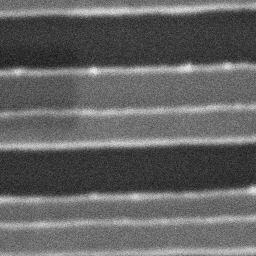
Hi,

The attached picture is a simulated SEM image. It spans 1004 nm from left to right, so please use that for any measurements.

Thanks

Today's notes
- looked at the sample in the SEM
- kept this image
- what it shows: lines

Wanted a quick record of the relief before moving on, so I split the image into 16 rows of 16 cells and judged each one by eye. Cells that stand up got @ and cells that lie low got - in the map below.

@@@@@@@@@@@@@---
----------------
----------------
----------------
-@@@@@@@@@@@@@@@
@@@@@@@@@@@@@@@@
@@@@@@@@@@@@@@@@
@@@@@@@@@@@@@@@@
@@@@@@@@@@@@@@@@
----------------
----------------
----------------
@@@@@@@@@@@@@@@@
@@@@@@@@@@@@@@@@
@@@@@@@@@@@@@@@@
@@@@@@@@@@@@@@@@